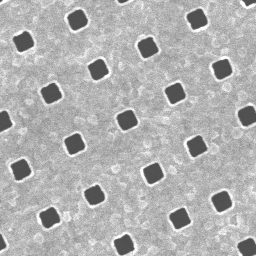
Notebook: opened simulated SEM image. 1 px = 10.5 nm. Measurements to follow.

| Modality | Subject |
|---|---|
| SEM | a regular array of holes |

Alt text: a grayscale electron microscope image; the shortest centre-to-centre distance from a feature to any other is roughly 556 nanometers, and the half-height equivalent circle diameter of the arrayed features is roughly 207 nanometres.